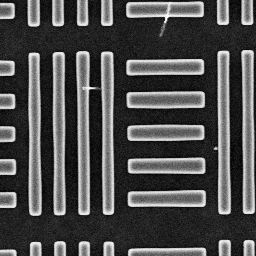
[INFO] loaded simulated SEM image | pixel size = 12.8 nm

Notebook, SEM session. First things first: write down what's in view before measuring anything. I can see groups of lines, slits or small figures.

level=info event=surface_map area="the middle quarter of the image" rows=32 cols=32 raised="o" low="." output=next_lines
...ooo....oo....oooooooooooooooo
...ooo....oo....oooooooooooooooo
...ooo....oo....................
...ooo....oo....................
...ooo....oo....................
....oo....oo....................
....oo....oo....................
....oo....oo....oooooooooooooooo
....oo....oo....oooooooooooooooo
....oo....oo....oooooooooooooooo
....oo....oo....oooooooooooooooo
....oo....oo....................
....oo....oo....................
....oo....oo....................
....oo....oo....................
....oo....oo.........oooooooooo.
....oo....oo....oooooooooooooooo
....oo....oo....oooooooooooooooo
....oo....oo....oooooooooooooooo
....oo....oo....................
....oo....oo....................
....oo....oo....................
....oo....oo....................
....oo....oo....................
....oo....oo....oooooooooooooooo
....oo....oo....oooooooooooooooo
....oo....oo....oooooooooooooooo
....oo....oo....................
....oo....oo....................
....oo....oo....................
....oo....oo....................
....oo....oo....................